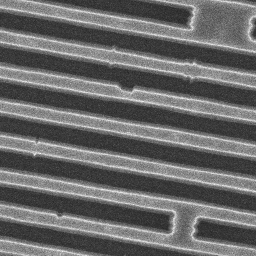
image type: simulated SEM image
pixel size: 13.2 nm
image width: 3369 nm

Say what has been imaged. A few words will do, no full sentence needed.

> parallel lines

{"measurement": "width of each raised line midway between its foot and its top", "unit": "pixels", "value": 13.8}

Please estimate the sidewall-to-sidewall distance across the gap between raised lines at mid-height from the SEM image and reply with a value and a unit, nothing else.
272 nanometers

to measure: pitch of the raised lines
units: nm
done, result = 451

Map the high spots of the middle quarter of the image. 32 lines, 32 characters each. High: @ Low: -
---------------@@@@@@@@@@@@@@@@@
---------------------@@@@@@@@@@@
----------------------------@@@@
@@@----------------------------@
@@@@@@@@@-----------------------
@@@@@@@@@@@@@@------------------
@@@@@@@@@@@@@@@@-@@@------------
-----@@@@@@@@@@@@@@@@@@@@@------
-----------@@@@@@@@@@@@@@@@@@@@-
------------------@@@@@@@@@@@@@@
------------------------@@@@@@@@
-----------------------------@@@
@@@@----------------------------
@@@@@@@@@@----------------------
@@@@@@@@@@@@@@@@----------------
--@@@@@@@@@@@@@@@@@@@@@---------
---------@@@@@@@@@@@@@@@@@@@----
--------------@@@@@@@@@@@@@@@@@@
-------------------@@@@@@@@@@@@@
-------------------------@@@@@@@
@------------------------------@
@@@@@@--------------------------
@@@@@@@@@@@---------------------
@@@@@@@@@@@@@@@@@---------------
-----@@@@@@@@@@@@@@@@@@---------
----------@@@@@@@@@@@@@@@@@@@---
---------------@@@@@@@@@@@@@@@@@
---------------------@@@@@@@@@@@
--------------------------@@@@@@
@-------------------------------
@@@@@@@-------------------------
@@@@@@@@@@@@@-------------------